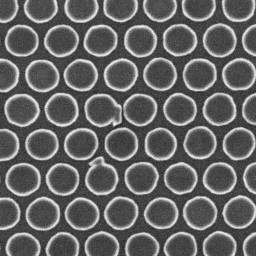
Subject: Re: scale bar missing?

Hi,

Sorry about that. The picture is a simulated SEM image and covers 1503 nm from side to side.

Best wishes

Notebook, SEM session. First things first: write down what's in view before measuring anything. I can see a regular array of raised bodies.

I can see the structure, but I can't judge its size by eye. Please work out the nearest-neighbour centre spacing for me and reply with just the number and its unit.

0.229 microns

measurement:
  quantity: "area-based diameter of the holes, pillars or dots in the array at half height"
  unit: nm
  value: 189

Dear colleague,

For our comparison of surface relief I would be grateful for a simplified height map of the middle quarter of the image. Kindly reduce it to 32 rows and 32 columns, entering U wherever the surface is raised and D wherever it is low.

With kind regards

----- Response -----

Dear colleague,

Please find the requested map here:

DUUUUUUDDDDUUUUUUUDDDUUUUUUDDDDU
UUUUUUUUDDUUUUUUUUDDUUUUUUUUDDUU
UUUUUUUUDDUUUUUUUUDDUUUUUUUUDDUU
UUUUUUUUDDUUUUUUUUDDUUUUUUUUDDUU
DUUUUUUUDDDUUUUUUUDDUUUUUUUUDDUU
DUUUUUUDDDDUUUUUUDDDDUUUUUUDDDDU
DDDDUDDDDDDDDUUDDDDDDDDUUDDDDDDD
DDDDDDDDDDDDDDDDDDDDDDDDDDDDDDDD
UUDDDDDUUUUUDDDDUUUUUUDDDDUUUUUU
UUUDDDUUUUUUUDDUUUUUUUUDDDUUUUUU
UUUDDUUUUUUUUUDUUUUUUUUDDUUUUUUU
UUUDDUUUUUUUUUUUUUUUUUUDDUUUUUUU
UUUDDUUUUUUUUUDUUUUUUUUDDUUUUUUU
UUUDDDUUUUUUUUDDUUUUUUDDDDUUUUUU
UUDDDDDUUUUUUUDDDUUUUDDDDDDUUUUD
DDDDDDDDDDDDDDDDDDDDDDDDDDDDDDDD
DDDUUUDDDDDDDUUUDDDDDDDUUUDDDDDD
DUUUUUUUDDDUUUUUUUDDDUUUUUUDDDDU
DUUUUUUUDDDUUUUUUUDDDUUUUUUUDDUU
UUUUUUUUDDUUUUUUUUDDDUUUUUUUDDUU
UUUUUUUUDDUUUUUUUUDDDUUUUUUUDDUU
UUUUUUUUDDDUUUUUUUDDDUUUUUUUDDUU
DUUUUUUDDDDUUUUUUDDDDUUUUUUDDDDU
DDUUUUDDUDDDDUUUDDDDDDDUUUDDDDDD
DDDDDDDUUUDDDDDDDDDDDDDDDDDDDDDD
UDDDDDDUUUUUDDDDDUUUUUDDDDDUUUUD
UUUDDDUUUUUUUDDDUUUUUUUDDDUUUUUU
UUUDDDUUUUUUUDDUUUUUUUUDDUUUUUUU
UUUUDDUUUUUUUDDUUUUUUUUDDUUUUUUU
UUUDDDUUUUUUUDDDUUUUUUUDDUUUUUUU
UUUDDDUUUUUUUDDDUUUUUUUDDDUUUUUU
UUUDDDDUUUUUDDDDDUUUUUDDDDDUUUUU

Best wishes